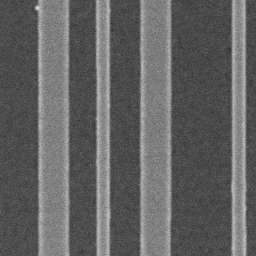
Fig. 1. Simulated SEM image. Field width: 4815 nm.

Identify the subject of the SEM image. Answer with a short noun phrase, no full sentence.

lines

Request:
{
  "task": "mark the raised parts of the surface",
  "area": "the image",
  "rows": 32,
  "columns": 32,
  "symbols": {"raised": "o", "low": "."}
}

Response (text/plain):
.....oooo...oo....ooo........oo.
.....oooo...oo....ooo........oo.
.....oooo...oo....ooo........oo.
.....oooo...oo....ooo........oo.
.....oooo...oo....ooo........oo.
.....ooo....oo....ooo........oo.
.....ooo....oo....ooo........oo.
.....oooo...oo....ooo........oo.
.....oooo...oo....ooo........oo.
.....ooo....oo....ooo........oo.
.....ooo....oo....ooo........oo.
.....ooo....oo....ooo........oo.
.....oooo...oo....ooo........oo.
.....oooo...oo....ooo........oo.
.....oooo...oo....ooo........oo.
.....ooo....oo....ooo........oo.
.....oooo...oo....ooo........oo.
.....oooo...oo....ooo........oo.
.....oooo...oo....ooo........oo.
.....oooo...oo....ooo........oo.
.....oooo...oo....ooo........oo.
.....ooo....oo....ooo........oo.
.....oooo...oo....ooo........oo.
.....oooo...oo....ooo........oo.
.....oooo...oo....ooo........oo.
.....oooo...oo....ooo........oo.
.....oooo...oo....ooo........oo.
.....oooo...oo....ooo........oo.
.....oooo...oo....ooo........oo.
.....oooo...oo....ooo........oo.
.....oooo...oo....ooo........oo.
.....oooo...oo....ooo........oo.